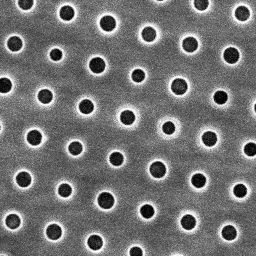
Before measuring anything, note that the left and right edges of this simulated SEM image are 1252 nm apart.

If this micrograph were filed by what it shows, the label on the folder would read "a regular array of holes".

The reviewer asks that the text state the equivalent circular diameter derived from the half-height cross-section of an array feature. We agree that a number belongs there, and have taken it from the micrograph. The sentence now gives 0.0832 µm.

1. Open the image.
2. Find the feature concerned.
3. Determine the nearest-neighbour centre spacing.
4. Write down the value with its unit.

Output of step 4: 0.207 micrometres